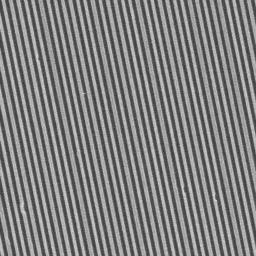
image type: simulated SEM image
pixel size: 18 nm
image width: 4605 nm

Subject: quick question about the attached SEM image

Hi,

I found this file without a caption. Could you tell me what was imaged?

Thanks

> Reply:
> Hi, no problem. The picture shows parallel lines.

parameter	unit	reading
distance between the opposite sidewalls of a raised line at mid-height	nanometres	55.1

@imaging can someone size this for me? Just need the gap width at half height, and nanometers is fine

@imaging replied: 72.7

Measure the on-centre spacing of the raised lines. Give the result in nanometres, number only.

131